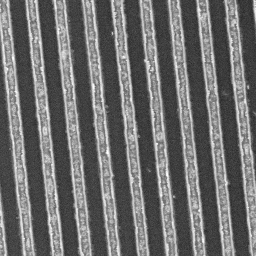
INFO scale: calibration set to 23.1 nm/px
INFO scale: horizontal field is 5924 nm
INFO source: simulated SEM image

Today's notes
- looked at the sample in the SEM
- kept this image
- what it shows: parallel lines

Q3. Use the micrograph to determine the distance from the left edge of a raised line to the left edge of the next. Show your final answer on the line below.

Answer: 656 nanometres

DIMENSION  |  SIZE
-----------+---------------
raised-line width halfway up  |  236 nm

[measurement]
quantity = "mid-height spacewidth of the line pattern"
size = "414 nm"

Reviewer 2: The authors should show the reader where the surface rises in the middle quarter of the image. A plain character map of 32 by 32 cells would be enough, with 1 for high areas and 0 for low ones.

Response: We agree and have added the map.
11000001100000110000011000001100
11000001100000110000011000001100
11000001100000110000011000001110
11000001100000110000011100001110
11000001100000111000011100001110
11000001100000111000011100001110
11000001110000111000011100000110
11100001110000011000001100000110
11100001110000011000001100000110
11100001110000011000001100000110
01100000110000011000001100000110
01100000110000011000001100000110
01100000110000011000001100000111
01100000110000011000001110000111
01100000110000011100001110000111
01100000110000011100001110000111
01110000111000011100000110000011
01110000111000011100000110000011
01110000111000001100000110000011
01110000011000001100000110000011
01110000011000001100000110000011
00110000011000001100000110000011
00110000011000001100000111000011
00110000011000001100000111000011
00110000011000001100000111000011
00110000011100001110000111000001
00111000011100000110000011000001
00111000011100001110000011000001
00111000011100000110000011000001
00111000001100000110000011000001
00011000001100000110000011000001
00011000001100000110000011000001